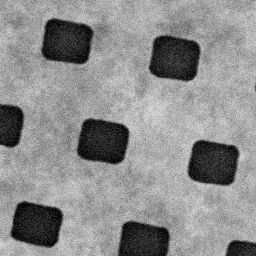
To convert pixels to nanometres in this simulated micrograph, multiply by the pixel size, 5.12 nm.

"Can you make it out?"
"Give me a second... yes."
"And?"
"holes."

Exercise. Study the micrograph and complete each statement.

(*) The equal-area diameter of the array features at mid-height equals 255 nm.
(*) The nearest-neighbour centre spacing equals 544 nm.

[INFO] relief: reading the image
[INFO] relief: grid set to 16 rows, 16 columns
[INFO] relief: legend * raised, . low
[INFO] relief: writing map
****************
***..***********
***...****..****
***...***...****
*********...****
****************
****************
.***************
.****...********
*****...****...*
************...*
*************.**
****************
*...************
*...****..******
*******....***..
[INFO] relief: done